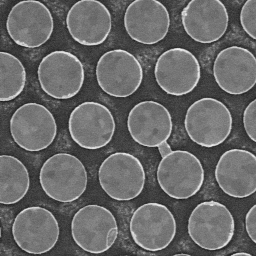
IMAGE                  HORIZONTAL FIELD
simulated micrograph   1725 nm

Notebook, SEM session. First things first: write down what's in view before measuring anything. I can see a regular array of raised bodies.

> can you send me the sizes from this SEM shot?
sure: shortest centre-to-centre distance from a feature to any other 393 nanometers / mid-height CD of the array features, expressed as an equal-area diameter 311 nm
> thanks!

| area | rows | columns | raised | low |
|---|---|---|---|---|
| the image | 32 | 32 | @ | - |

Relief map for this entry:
--@@@----@@@@---@@@@----@@@@---@
-@@@@@---@@@@@--@@@@@--@@@@@--@@
-@@@@@--@@@@@@--@@@@@--@@@@@--@@
-@@@@@@--@@@@@--@@@@@--@@@@@---@
-@@@@@---@@@@---@@@@@---@@@@---@
---@@------@--------------------
-------@------@@-----@@@----@@@-
@@---@@@@@---@@@@---@@@@@--@@@@@
@@@--@@@@@--@@@@@@--@@@@@--@@@@@
@@@--@@@@@--@@@@@@-@@@@@@--@@@@@
@@@--@@@@@--@@@@@---@@@@---@@@@@
@@----@@@@---@@@@----@@------@@-
-------------------------@@-----
---@@@----@@@----@@@@---@@@@---@
--@@@@---@@@@@--@@@@@--@@@@@@--@
-@@@@@@--@@@@@--@@@@@--@@@@@@--@
-@@@@@@--@@@@@--@@@@@---@@@@@--@
--@@@@@--@@@@@---@@@@---@@@@----
---@@------@--------@-----------
-------@@-----@@@---@@@@----@@@@
@@@---@@@@---@@@@@--@@@@@--@@@@@
@@@--@@@@@@-@@@@@@--@@@@@--@@@@@
@@@--@@@@@@-@@@@@@--@@@@@--@@@@@
@@@--@@@@@@--@@@@@--@@@@@---@@@@
@@@---@@@@----@@@----@@@-----@@-
------------------@@-----@@-----
---@@@----@@@@---@@@@---@@@@@--@
--@@@@@--@@@@@---@@@@@--@@@@@--@
--@@@@@--@@@@@--@@@@@@--@@@@@--@
--@@@@@--@@@@@---@@@@@--@@@@@--@
--@@@@@---@@@----@@@@----@@@----
----@------@--------------------